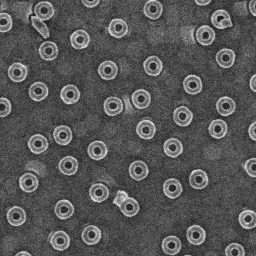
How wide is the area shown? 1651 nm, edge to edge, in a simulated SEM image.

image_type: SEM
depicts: a regular array of ring-shaped raised bodies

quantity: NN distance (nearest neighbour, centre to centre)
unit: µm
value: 0.188